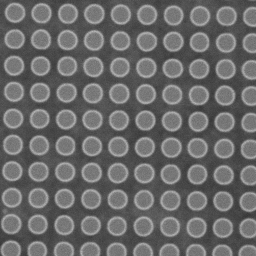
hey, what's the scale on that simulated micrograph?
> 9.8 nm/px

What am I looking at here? an array of small figures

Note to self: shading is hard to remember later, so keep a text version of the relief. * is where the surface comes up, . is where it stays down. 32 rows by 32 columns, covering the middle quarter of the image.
***..*****..****..*****..****...
***..*****..****..*****..*****..
**....***...****...***...****...
................................
................................
**....***...***....***....**....
***..****...****..*****..****...
***..****..*****..*****..****..*
***..****...****..*****..****..*
......**.....**....***....***...
................................
................................
**...****...***....***...***....
***..****...****..*****..****..*
***..****...****..*****..****..*
**...****...****..****...****...
..........................**....
................................
**....**.....**.................
***..****..*****..****...****...
***..****..*****..*****.*****..*
***..****..*****..*****.*****..*
**....**....***....***...****...
................................
................................
**...****...***....***....**....
***..****..*****..****...****..*
***..****..*****..****..*****..*
**...****..****...****...****..*
.............*.....**....***....
................................
*...............................